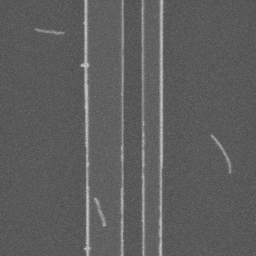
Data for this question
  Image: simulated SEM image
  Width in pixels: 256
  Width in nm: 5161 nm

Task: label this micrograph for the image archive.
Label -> lines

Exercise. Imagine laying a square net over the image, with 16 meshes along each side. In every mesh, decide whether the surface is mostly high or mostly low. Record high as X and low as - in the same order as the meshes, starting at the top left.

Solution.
-----XXXXX------
-----XXXXX------
-----XXXXX------
-----XXXXX------
-----XXXXX------
-----XXXXX------
-----XXXXX------
-----XXXXX------
-----XXXXX------
-----XXXXX------
-----XXXXX------
-----XXXXX------
-----XXXXX------
-----XXXXX------
-----XXXXX------
-----XXXXX------